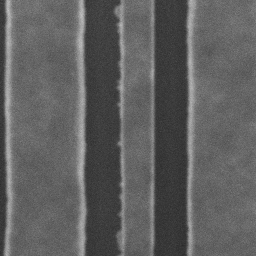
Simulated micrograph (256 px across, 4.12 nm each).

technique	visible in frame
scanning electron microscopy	lines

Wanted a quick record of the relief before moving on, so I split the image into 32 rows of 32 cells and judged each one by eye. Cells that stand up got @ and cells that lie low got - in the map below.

-@@@@@@@@@-----@@@@-----@@@@@@@@
-@@@@@@@@@-----@@@@-----@@@@@@@@
-@@@@@@@@@-----@@@@----@@@@@@@@@
-@@@@@@@@@-----@@@@----@@@@@@@@@
-@@@@@@@@@-----@@@@----@@@@@@@@@
-@@@@@@@@@-----@@@@----@@@@@@@@@
-@@@@@@@@@-----@@@@----@@@@@@@@@
-@@@@@@@@@-----@@@@----@@@@@@@@@
-@@@@@@@@@-----@@@@----@@@@@@@@@
-@@@@@@@@@-----@@@@-----@@@@@@@@
-@@@@@@@@@@----@@@@-----@@@@@@@@
-@@@@@@@@@@----@@@@-----@@@@@@@@
-@@@@@@@@@@----@@@@-----@@@@@@@@
-@@@@@@@@@@----@@@@-----@@@@@@@@
-@@@@@@@@@@----@@@@-----@@@@@@@@
-@@@@@@@@@@----@@@@----@@@@@@@@@
-@@@@@@@@@-----@@@@-----@@@@@@@@
-@@@@@@@@@@----@@@@----@@@@@@@@@
-@@@@@@@@@@----@@@@----@@@@@@@@@
-@@@@@@@@@@----@@@@-----@@@@@@@@
-@@@@@@@@@-----@@@@-----@@@@@@@@
-@@@@@@@@@-----@@@@----@@@@@@@@@
-@@@@@@@@@-----@@@@----@@@@@@@@@
-@@@@@@@@@@----@@@@----@@@@@@@@@
-@@@@@@@@@@----@@@@----@@@@@@@@@
-@@@@@@@@@@----@@@@----@@@@@@@@@
-@@@@@@@@@@----@@@@----@@@@@@@@@
-@@@@@@@@@@----@@@@----@@@@@@@@@
-@@@@@@@@@@----@@@@----@@@@@@@@@
-@@@@@@@@@@----@@@@-----@@@@@@@@
-@@@@@@@@@@----@@@@----@@@@@@@@@
-@@@@@@@@@@----@@@@----@@@@@@@@@